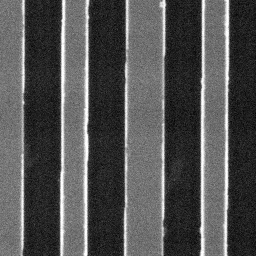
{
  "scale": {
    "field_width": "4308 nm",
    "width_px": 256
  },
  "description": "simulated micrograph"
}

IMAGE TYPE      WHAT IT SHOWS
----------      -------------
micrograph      lines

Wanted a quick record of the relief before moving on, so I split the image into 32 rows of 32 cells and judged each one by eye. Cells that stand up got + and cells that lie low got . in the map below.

+++.....+++.....+++++....++++...
+++.....+++.....+++++....++++...
+++.....+++.....+++++....++++...
+++.....+++.....+++++....++++...
+++.....+++.....++++.....++++...
+++.....+++.....+++++....++++...
+++.....+++.....+++++....++++...
+++.....+++.....++++.....++++...
+++.....+++.....++++.....++++...
+++.....+++.....++++.....+++....
+++.....+++.....++++.....+++....
+++.....+++.....++++.....+++....
+++.....+++.....++++.....+++....
+++.....+++.....++++.....+++....
+++.....+++.....++++.....+++....
+++.....+++.....++++.....+++....
+++.....+++.....++++.....+++....
+++.....+++.....++++.....+++....
+++.....+++.....++++.....+++....
+++.....+++.....++++.....+++....
+++.....+++.....++++.....+++....
+++.....+++.....++++.....+++....
+++.....+++.....++++.....+++....
+++.....+++.....++++.....+++....
+++.....+++.....++++.....+++....
+++.....+++.....++++.....+++....
+++.....+++.....++++.....+++....
+++.....+++.....++++.....+++....
+++.....+++.....++++.....+++....
+++.....+++.....++++.....+++....
+++.....+++.....++++.....+++....
+++.....+++.....++++.....+++....